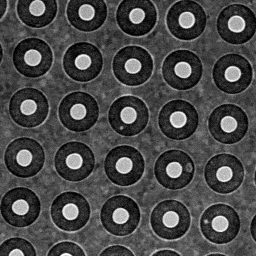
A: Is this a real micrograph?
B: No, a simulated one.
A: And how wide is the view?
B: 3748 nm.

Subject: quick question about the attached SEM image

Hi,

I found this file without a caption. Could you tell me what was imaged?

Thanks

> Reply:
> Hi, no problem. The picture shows an array of small figures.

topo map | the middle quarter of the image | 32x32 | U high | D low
DDDUUUDDDDUUDDDUUUUDDDDUDDDDUUUD
DDDDDDDDDUUUDDDDUUUDDDUUDDDDUUUU
DDDDDDDDDUUUDDDDDDDDDDUUDDDDUUUD
UDDDDDDDUUUUUDDDDDDDDDUUUDDDDDDD
UUUDDDUUUUUUUUDDDDDDDUUUUDDDDDDD
UUUUUUUUUUUUUUUDDDDUUUUUUUDDDDDD
UUUUUUUUUUUUUUUUUUUUUUUUUUUUDDDU
UDDDDDUUUUUUUUUUUUUUUUUUUUUUUUUU
DDDDDDDUUUUUUDDDDDDUUUUUUUUUUUUU
DDDDDDDDUUUUDDDDDDDDUUUUUUDDDDDU
DDUUUDDDDUUUDDDDDDDDDUUUUDDDDDDD
DDUUUDDDDUUDDDDUUUDDDUUUDDDDDDDD
DDUUUDDDDUUDDDUUUUDDDUUUDDDUUUDD
DDUUUDDDDUUDDDUUUUDDDUUDDDDUUUDD
DDDDDDDDUUUDDDDUUDDDDUUDDDDUUUDD
DDDDDDDUUUUUDDDDDDDDDUUUDDDDUDDD
UDDDDDUUUUUUDDDDDDDDUUUUDDDDDDDD
UUUUUUUUUUUUUDDDDDDUUUUUUDDDDDDD
UUUUUUUUUUUUUUUUUUUUUUUUUUDDDDDU
UDDDUUUUUUUUUUUUUUUUUUUUUUUUUUUU
DDDDDDUUUUUUUDDDDUUUUUUUUUUUUUUU
DDDDDDDUUUUUDDDDDDDUUUUUUUDDDUUU
DDDDDDDDUUUDDDDDDDDUUUUUDDDDDDDU
DUUUDDDDUUDDDDDDDDDDUUUDDDDDDDDD
DUUUDDDDUUDDDUUUUDDDUUUDDDDDDDDD
DUUUDDDDUUDDDUUUUDDDUUUDDDUUUDDD
DDDDDDDUUUDDDUUUUDDDUUDDDDUUUDDD
DDDDDDDUUUDDDDDDDDDDUUUDDDUUUDDD
DDDDDDUUUUUDDDDDDDDUUUUDDDDDDDDD
UUUUUUUUUUUUDDDDDDUUUUUDDDDDDDDD
UUUUUUUUUUUUUUDDDUUUUUUUUDDDDDDU
UUUUUUUUUUUUUUUUUUUUUUUUUUUDUUUU